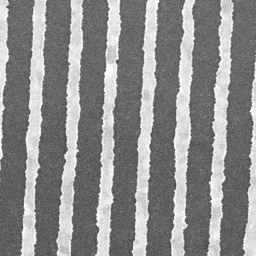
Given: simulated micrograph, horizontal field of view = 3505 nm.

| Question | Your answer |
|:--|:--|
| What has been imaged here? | parallel lines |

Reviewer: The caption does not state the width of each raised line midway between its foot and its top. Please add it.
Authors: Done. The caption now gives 0.152 um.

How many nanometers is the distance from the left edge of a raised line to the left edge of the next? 510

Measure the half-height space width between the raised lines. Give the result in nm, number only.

356